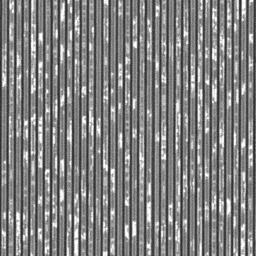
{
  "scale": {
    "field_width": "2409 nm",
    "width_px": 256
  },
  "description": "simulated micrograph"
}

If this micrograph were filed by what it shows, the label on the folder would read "parallel lines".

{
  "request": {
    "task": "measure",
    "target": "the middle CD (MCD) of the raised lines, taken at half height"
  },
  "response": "0.04 um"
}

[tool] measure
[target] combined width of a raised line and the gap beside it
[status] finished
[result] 68.2 nm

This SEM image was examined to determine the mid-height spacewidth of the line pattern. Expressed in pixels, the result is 3.38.